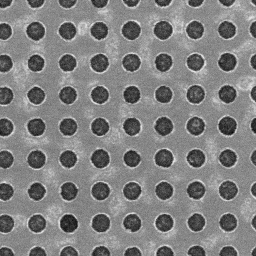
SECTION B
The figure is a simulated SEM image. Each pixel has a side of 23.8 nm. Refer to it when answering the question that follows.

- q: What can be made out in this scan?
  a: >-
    a regular array of holes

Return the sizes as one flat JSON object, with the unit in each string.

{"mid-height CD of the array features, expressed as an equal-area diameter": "450 nm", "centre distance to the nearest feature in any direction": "0.754 microns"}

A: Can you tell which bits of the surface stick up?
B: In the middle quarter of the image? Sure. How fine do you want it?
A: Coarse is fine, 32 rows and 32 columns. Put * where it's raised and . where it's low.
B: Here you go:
...***.....****....****....****.
..*****....****...*****...******
********************************
********************************
********************************
..******..******..******.*******
...****....****....****....****.
...****....****....****....***..
...****....****....****....****.
...****....*****...*****...****.
********************************
********************************
********************************
..******..******..******..*****.
...****....****....****....****.
...****.....***....****.....**..
...****....****....****....****.
...****....*****..******..*****.
********************************
********************************
********************************
*.******..******.*******..******
...****....****....****....****.
...****.....***....****.....***.
...****.....***....****....****.
...****....*****..*****....*****
********************************
********************************
********************************
..******..******..******..******
...****....****....****....****.
....***.....***.....***.....***.